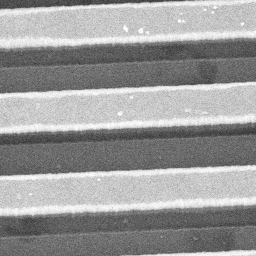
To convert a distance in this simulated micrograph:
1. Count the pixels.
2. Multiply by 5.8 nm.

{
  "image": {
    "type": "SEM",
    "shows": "lines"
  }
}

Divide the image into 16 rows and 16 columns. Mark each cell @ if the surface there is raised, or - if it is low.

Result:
--@@@@@@@@@@@@@@
@@@@@@@@@@@@@@@@
@@@@@@@@@@@@----
----------------
----------------
--------@@@@@@@@
@@@@@@@@@@@@@@@@
@@@@@@@@@@@@@@@@
----------------
----------------
-----------@@@@@
@@@@@@@@@@@@@@@@
@@@@@@@@@@@@@@@@
----------------
----------------
----------------